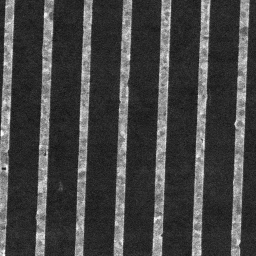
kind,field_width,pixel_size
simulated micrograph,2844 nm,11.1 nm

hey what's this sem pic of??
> parallel lines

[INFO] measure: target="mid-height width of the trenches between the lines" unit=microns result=0.345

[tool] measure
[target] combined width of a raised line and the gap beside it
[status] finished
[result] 434 nm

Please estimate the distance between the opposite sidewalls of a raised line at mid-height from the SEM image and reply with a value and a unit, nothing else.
88.8 nm